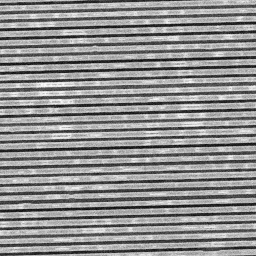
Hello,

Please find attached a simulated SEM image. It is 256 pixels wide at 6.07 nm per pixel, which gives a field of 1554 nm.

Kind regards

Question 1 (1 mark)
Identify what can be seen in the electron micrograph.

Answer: parallel lines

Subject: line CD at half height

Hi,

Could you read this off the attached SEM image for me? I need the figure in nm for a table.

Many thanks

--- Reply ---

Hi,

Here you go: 30.4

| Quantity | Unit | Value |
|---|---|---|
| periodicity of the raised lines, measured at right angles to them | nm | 52.4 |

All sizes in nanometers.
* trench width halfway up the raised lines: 18.2